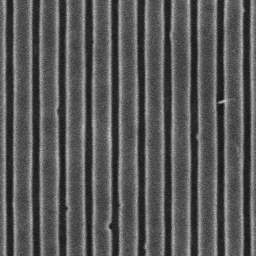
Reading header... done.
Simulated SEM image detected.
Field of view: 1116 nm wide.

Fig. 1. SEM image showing parallel lines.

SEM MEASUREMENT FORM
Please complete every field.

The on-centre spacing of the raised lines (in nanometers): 115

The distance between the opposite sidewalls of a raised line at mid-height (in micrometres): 0.0828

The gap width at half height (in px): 7.61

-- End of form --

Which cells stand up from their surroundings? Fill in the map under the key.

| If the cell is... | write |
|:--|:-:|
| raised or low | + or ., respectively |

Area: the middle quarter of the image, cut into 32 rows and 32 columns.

+++++..+++++..++++..+++++..++++.
.++++..+++++..++++..+++++..++++.
.++++..+++++..++++..+++++..++++.
.++++..+++++..++++..+++++..++++.
.++++..+++++..++++..+++++..++++.
.++++..+++++..++++..+++++..++++.
.++++..+++++..++++..+++++..++++.
.++++..+++++..++++..+++++..++++.
.++++..+++++..++++..+++++..++++.
.++++..+++++..++++..+++++..++++.
.++++..+++++..++++..+++++..++++.
.++++..+++++..++++..+++++..++++.
.++++..+++++..++++..+++++..++++.
.++++..+++++..++++..+++++..++++.
.++++..+++++..++++..+++++..++++.
.++++..+++++..++++..+++++..++++.
.++++..+++++..++++...++++..++++.
.++++..+++++..++++...++++..++++.
.++++..+++++..++++...++++..++++.
.++++..+++++..++++...++++..++++.
.++++..+++++..++++...++++..++++.
.++++..+++++..++++...++++..++++.
.++++..+++++..++++...++++..++++.
.++++..+++++..++++...++++..+++++
.++++..+++++..++++...++++..++++.
.++++..+++++..++++...++++..++++.
.++++..+++++..++++...++++..++++.
.++++..+++++..++++...++++..++++.
.++++..+++++..++++...++++..++++.
.++++..+++++..++++...++++..++++.
.++++..+++++..++++...++++..++++.
.++++..+++++..++++...++++..++++.